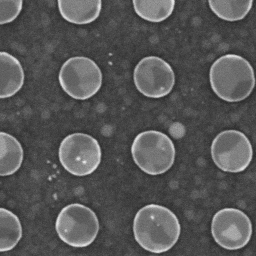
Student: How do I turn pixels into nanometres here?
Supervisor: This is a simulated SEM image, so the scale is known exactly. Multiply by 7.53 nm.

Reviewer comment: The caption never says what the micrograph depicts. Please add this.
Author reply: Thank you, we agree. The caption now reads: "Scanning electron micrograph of a regular array of raised bodies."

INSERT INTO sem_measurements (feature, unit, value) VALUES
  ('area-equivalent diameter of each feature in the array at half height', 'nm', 315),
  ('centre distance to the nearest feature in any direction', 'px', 73.6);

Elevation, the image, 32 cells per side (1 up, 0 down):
11100001111110000111110000111110
11000000111100000111100000011110
10000000111100000001000000000000
00000000000000000000000000000000
00000000000000000000000000000000
00000000000000000000000000000000
00000000000000000000000000000000
11000000011000000011000000011110
11100000111100000111100000111110
11100001111110000111110000111111
11100000111110000111110000111111
11000000111100000011100000011110
00000000000000000000000000001100
00000000000000000000000000000000
00000000000000000000000000000000
00000000000000000000000000000000
00000000000000000011011000001100
11000000111100000111100000011110
11100001111100000111110000011110
11100001111100000111110000011110
11100000111100000111110000011110
11000000011000000011000000000000
00000000000000000000000000000000
00000000000000000000000000000000
00000000000000000000000000000000
00000000000000000000000000000000
10000000111100000111100000011100
11000001111100000111110000011110
11100001111100000111110000011110
11100000111100000111110000011110
11000000011000000011110000011110
00000000000000000000000000000000